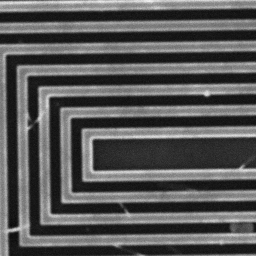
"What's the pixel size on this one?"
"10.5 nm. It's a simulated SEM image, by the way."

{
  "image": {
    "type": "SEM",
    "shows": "groups of lines, slits or small figures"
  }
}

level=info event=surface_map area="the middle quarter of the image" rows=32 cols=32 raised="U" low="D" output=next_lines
DDDDUUUUUUUUUUUUUUUUUUUUUUUUUUUU
UUUUUUUUUUUUUUUUUUUUUUUUUUUUUUUU
UUUUUUUUDDDDDDDDDDDDDDDDDDDDDDDD
DDDDDDDDDDDDDDDDDDDDDDDDDDDDDDDD
DDDDDDDDDDDDDDDDDDDDDDDDDDDDDDDD
DDDDDDDDDDDDDDDDDDDDUUUUUUUUUUUU
UUUUUUUUUUUUUUUUUUUUUUUUUUUUUUUU
UUUUUUUUUUUUUUUUUUUUUUUDDDDDDDDD
DDDDDDDDDDDDDDDDDDDDDDDDDDDDDDDD
DDDDDDDDDDDDDDDDDDDDDDDDDDDDDDDD
DDDDDDDDDDDDDDDDDDDDDDDDDDDDDDDD
UUUUUUUUUUUUUUUUUUUUUUUUUUUUUUUU
UUUUUUUUUUUUUUUUUUUUUUUUUUUUUUUU
UUDDDDDDDDDDDDDDDDDDDDDDDDDDDDDD
UDDDDDDDDDDDDDDDDDDDDDDDDDDDDDDD
UDDDDDDDDDDDDDDDDDDDDDDDDDDDDDDD
UDDDDUUUUUUUUUUUUUUUUUUUUUUUUUUU
UDDDDUUUUUUUUUUUUUUUUUUUUUUUUUUU
UDDDDUUDDDDDDDDDDDDDDDDDDDDDDDDD
UDDDDUUDDDDDDDDDDDDDDDDDDDDDDDDD
UDDDDUUDDDDDDDDDDDDDDDDDDDDDDDDD
UUDDDUUDDDDDDDDDDDDDDDDDDDDDDDDD
UUDDDUUDDDDDDDDDDDDDDDDDDDDDDDDD
UUDDDUUDDDDDDDDDDDDDDDDDDDDDDDDD
UUDDDUUDDDDDDDDDDDDDDDDDDDDDDDDD
UUDDDUUDDDDDDDDDDDDDDDDDDDDDDDDD
UUDDDUUDDDDDDDDDDDDDDDDDDDDDDDDD
UUDDDUUUUUUUUUUUUUUUUUUUUUUUUUUU
UUDDDUUUUUUUUUUUUUUUUUUUUUUUUUUU
UUDDDDDDDDDDDDDDDDDDDDDDDDDDDDDD
UUDDDDDDDDDDDDDDDDDDDDDDDDDDDDDD
UUDDDDDDDDDDDDDDDDDDDDDDDDDDDDDD